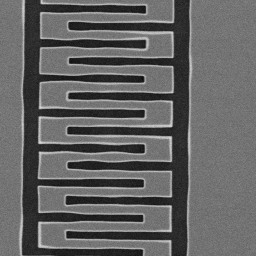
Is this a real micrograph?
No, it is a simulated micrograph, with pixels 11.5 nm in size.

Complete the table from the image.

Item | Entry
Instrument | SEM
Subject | groups of lines, slits or small figures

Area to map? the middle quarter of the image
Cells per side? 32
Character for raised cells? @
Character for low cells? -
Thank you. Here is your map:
@@@@@@@@@@@@@@@@@@@@@@@@@-------
@@@@@@@@@@@@@@@@@@@@@@@@@@@-----
@@@@@@-------@@@@@@@@@@@@@@----@
--------------------@@@@@@@----@
@@@@@---------------@@@@@@@----@
@@@@@@@@@@@@@@@@@@@@@@@@@@@----@
@@@@@@@@@@@@@@@@@@@@@@@@@@@----@
@------------------------------@
@------------------------------@
@@@@@@@@@@@@@@@@@@@@@@@@@@@----@
@@@@@@@@@@@@@@@@@@@@@@@@@@@----@
--------------------@@@@@@@----@
--------------------@@@@@@@----@
@@@@@@@@@@----------@@@@@@@----@
@@@@@@@@@@@@@@@@@@@@@@@@@@@----@
@--@@@@@------@@@@@@@@@@-------@
@------------------------------@
@------------------------------@
@@@@@@@@@@@@@@@@@@@@@@@@@@@----@
@@@@@@@@@@@@@@@@@@@@@@@@@@@----@
--------------------@@@@@@@----@
--------------------@@@@@@@----@
@@@@@@@@@@@@@@@@@@@@@@@@@@@----@
@@@@@@@@@@@@@@@@@@@@@@@@@@@----@
@------------------------------@
@------------------------------@
@@@@@--------------------------@
@@@@@@@@@@@@@@@@@@@@@@@@@@@----@
@@@@@@@@@@@@@@@@@@@@@@@@@@@----@
--------------------@@@@@@@----@
--------------------@@@@@@@----@
@@@@@@@@@@@@@@@@@@@@@@@@@@@----@